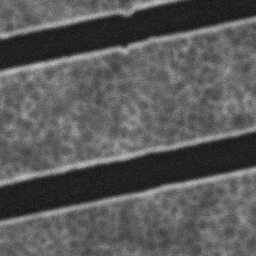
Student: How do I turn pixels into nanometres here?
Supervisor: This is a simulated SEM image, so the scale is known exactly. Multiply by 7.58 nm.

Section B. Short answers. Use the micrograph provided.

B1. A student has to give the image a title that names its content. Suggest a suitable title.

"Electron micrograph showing one or a few lines or trenches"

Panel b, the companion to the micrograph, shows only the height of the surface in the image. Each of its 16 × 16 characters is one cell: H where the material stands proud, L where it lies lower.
HHHHHHHHHLLLLLLL
HHHHLLLLLLLLLLLH
LLLLLLLLLLHHHHHH
LLLLLHHHHHHHHHHH
LHHHHHHHHHHHHHHH
HHHHHHHHHHHHHHHH
HHHHHHHHHHHHHHHH
HHHHHHHHHHHHHHHH
HHHHHHHHHHHHHHLL
HHHHHHHHHLLLLLLL
HHHHLLLLLLLLLLLL
LLLLLLLLLLLLHHHH
LLLLLLLHHHHHHHHH
LLHHHHHHHHHHHHHH
HHHHHHHHHHHHHHHH
HHHHHHHHHHHHHHHH